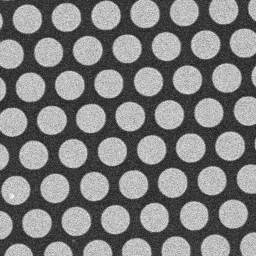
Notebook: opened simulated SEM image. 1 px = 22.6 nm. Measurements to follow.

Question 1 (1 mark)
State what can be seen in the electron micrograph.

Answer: an array of small figures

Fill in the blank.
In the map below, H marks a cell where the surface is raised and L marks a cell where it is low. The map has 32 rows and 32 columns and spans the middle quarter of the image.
LLLLLLLLLLLLLLLLLLLLLLLLLLLLLLLL
LLLLLLLLLLLLLLLLLLLHHHHLLLLLHHHH
HHHHLLLLLHHHHHLLLLHHHHHHLLLLHHHH
HHHHHLLLHHHHHHLLLLHHHHHHLLLHHHHH
HHHHHLLLHHHHHHHLLLHHHHHHHLLHHHHH
HHHHHLLLHHHHHHHLLLHHHHHHHLLLHHHH
HHHHHLLLHHHHHHLLLLHHHHHHLLLLHHHH
HHHHLLLLLHHHHHLLLLLHHHHLLLLLLLLL
HHHLLLLLLLLLLLLLLLLLLLLLLLLLLLLL
LLLLLLLLLLLLLLLLLLLLLLLLLHHHLLLL
LLLLLHHHHLLLLLHHHHHLLLLHHHHHHLLL
LLLLHHHHHHLLLHHHHHHHLLLHHHHHHHLL
LLLHHHHHHHLLLHHHHHHHLLLHHHHHHHLL
HLLHHHHHHHLLLHHHHHHHLLLHHHHHHHLL
HLLHHHHHHHLLLHHHHHHHLLLHHHHHHLLL
LLLLHHHHHHLLLLHHHHHLLLLLHHHHHLLL
LLLLLHHHHLLLLLLHHHLLLLLLLLLLLLLL
LLLLLLLLLLLLLLLLLLLLLLLLLLLLLLLL
LLLLLLLLLLLLHLLLLLLLHHHHLLLLLHHH
HHHHLLLLLLHHHHHLLLLHHHHHHLLLHHHH
HHHHHLLLLHHHHHHLLLLHHHHHHLLLHHHH
HHHHHHLLLHHHHHHHLLHHHHHHHLLLHHHH
HHHHHHLLLHHHHHHHLLHHHHHHHLLLHHHH
HHHHHHLLLHHHHHHLLLLHHHHHHLLLLHHH
HHHHHLLLLLHHHHLLLLLLHHHHLLLLLLLH
LHHHLLLLLLLLLLLLLLLLLLLLLLLLLLLL
LLLLLLLLLLLLLLLLLLLLLLLLLLHHHLLL
LLLLLLHHHLLLLLLHHHHHLLLLHHHHHHLL
LLLLLHHHHHLLLLHHHHHHLLLLHHHHHHHL
HLLLHHHHHHHLLLHHHHHHHLLLHHHHHHHL
HLLLHHHHHHHLLLHHHHHHHLLLHHHHHHHL
HLLLHHHHHHHLLLHHHHHHHLLLHHHHHHLL